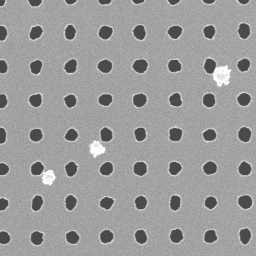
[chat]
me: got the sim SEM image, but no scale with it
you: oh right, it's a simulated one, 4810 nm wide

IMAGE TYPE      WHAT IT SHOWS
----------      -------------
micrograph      a regular array of holes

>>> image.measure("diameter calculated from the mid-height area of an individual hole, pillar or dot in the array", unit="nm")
248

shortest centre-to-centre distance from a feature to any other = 634 nm